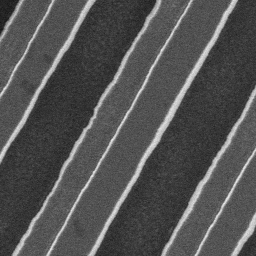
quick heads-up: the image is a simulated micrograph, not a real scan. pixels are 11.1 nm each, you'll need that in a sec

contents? lines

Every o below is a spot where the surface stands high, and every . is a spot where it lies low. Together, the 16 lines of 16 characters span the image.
.oooo.....oooo..
.oooo....ooooo..
oooo.....oooo...
oooo....ooooo...
ooo....ooooo....
ooo....ooooo....
oo....ooooo.....
oo....oooo.....o
o....ooooo....oo
.....oooo.....oo
....ooooo....ooo
....oooo.....ooo
...ooooo....oooo
..ooooo.....oooo
..ooooo....ooooo
.ooooo....ooooo.